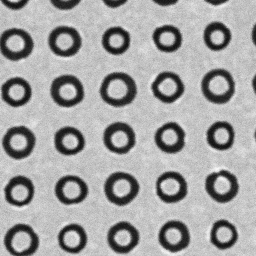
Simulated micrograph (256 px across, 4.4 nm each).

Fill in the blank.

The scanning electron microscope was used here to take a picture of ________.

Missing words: a regular array of ring-shaped grooves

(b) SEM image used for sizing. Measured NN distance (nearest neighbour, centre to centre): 215 nm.